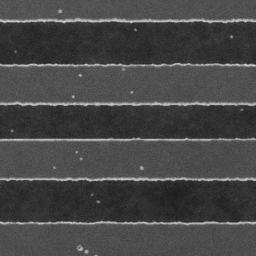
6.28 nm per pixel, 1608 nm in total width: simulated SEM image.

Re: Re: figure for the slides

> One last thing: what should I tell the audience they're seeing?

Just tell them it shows lines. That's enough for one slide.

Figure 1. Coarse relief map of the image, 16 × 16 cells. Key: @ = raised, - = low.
@@@@@@@@@@@@@@@@
----------------
----------------
----------------
@@@@@@@@@@@@@@@@
@@@@@@@@@@@@@@@@
@@@@@@@@@@@@@@@@
----------------
----------------
@@@@@@@@@@@@@@@@
@@@@@@@@@@@@@@@@
----------------
----------------
----------------
@@@@@@@@@@@@@@@@
@@@@@@@@@@@@@@@@